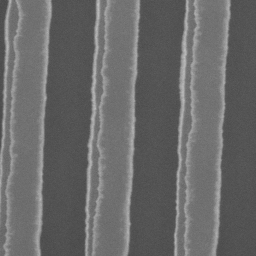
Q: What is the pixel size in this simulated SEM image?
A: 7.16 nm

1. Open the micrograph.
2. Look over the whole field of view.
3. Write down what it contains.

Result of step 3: lines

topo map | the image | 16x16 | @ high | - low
-@@---@@@---@@--
@@@---@@@---@@--
@@@---@@@--@@@--
@@@---@@---@@@--
@@@---@@---@@@--
@@@---@@---@@@--
@@@---@@---@@@--
@@@---@@---@@@--
@@@---@@---@@@--
@@@---@@---@@@--
@@@---@@---@@@--
@@@---@@---@@@--
@@@--@@@---@@@--
@@@--@@@---@@@--
@@---@@@---@@@--
@@---@@@---@@---